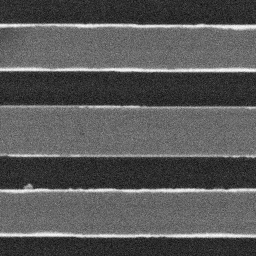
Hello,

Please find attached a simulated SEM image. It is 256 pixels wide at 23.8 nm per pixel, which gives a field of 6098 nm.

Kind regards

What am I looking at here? lines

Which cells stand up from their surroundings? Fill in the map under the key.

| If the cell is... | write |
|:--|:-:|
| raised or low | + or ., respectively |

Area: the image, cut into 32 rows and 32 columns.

................................
................................
................................
++++++++++++++++++++++++++++++++
++++++++++++++++++++++++++++++++
++++++++++++++++++++++++++++++++
++++++++++++++++++++++++++++++++
++++++++++++++++++++++++++++++++
++++++++++++++++++++++++++++++++
................................
................................
................................
................................
++++++++++++++++++++++++++++++++
++++++++++++++++++++++++++++++++
++++++++++++++++++++++++++++++++
++++++++++++++++++++++++++++++++
++++++++++++++++++++++++++++++++
++++++++++++++++++++++++++++++++
.............................+++
................................
................................
................................
................................
++++++++++++++++++++++++++++++++
++++++++++++++++++++++++++++++++
++++++++++++++++++++++++++++++++
++++++++++++++++++++++++++++++++
++++++++++++++++++++++++++++++++
................................
................................
................................